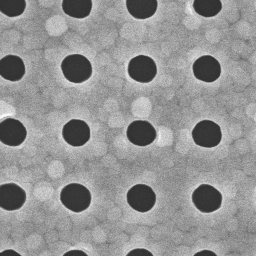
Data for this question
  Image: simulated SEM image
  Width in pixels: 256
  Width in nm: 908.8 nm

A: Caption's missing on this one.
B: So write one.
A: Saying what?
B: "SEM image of a regular array of holes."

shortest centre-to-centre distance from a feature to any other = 0.229 microns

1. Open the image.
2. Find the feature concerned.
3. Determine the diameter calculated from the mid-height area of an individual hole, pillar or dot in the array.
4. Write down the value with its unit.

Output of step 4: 100 nanometres